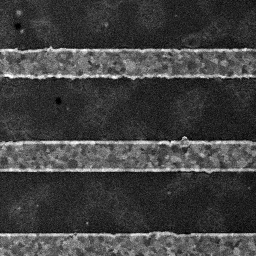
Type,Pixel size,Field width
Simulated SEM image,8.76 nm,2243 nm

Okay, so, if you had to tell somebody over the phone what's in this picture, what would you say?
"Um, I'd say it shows one or a few lines or trenches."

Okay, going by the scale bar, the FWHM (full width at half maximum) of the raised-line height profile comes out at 239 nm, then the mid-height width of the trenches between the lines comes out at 567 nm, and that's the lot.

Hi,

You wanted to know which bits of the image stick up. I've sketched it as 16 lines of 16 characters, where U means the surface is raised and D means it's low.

DDDDDDDDDDDDDDDD
DDDDDDDDDDDDDDDD
DDDDDDDDDDDDDDDD
UUUUUUUUUUUUUUUU
UUUUUUUUUUUUUUUU
DDDDDDDDDDDDDDDD
DDDDDDDDDDDDDDDD
DDDDDDDDDDDDDDDD
DDDDDDDDDDDDDDDD
UUUUUUUUUUUUUUUU
UUUUUUUUUUUUUUUU
DDDDDDDDDDDDDDDD
DDDDDDDDDDDDDDDD
DDDDDDDDDDDDDDDD
DDDDDDDDDDDDDDDD
UUUUUUUUUUUUUUUU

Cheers